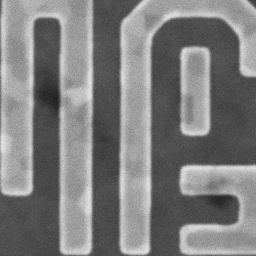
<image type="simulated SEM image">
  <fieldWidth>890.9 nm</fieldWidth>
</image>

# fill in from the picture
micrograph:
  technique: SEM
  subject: wiring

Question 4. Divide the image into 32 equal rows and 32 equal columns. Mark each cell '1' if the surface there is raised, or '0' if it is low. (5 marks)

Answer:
11111111111000000011111111111110
11111111111000000111111111111111
11110000111000001111100000001111
11110000111000011111000000000111
11110000111000011110000000000011
11110000111000011110000000000011
11110000111000011110000111000011
11110000111000011110000111000011
11110000111000011110000111000011
11110000111000011110000111000000
11110000111000011110000111000000
11110000111000011110000111000000
11110000111000011110000111000000
11110000111000011110000111000000
11110000111000011110000111000000
11110000111000011110000111000000
11110000111000011110000111000000
11110000111000011110000000000000
11110000111000011110000000000000
11110000111000011110000000000000
11110000111000011110000000000000
11110000111000011110000111111111
11110000111000011110000111111111
11110000111000011110000111111111
00000000111000011110000000000011
00000000111000011110000000000011
00000000111000011110000000000011
00000000111000011110000000000011
00000000111000011110000111111111
00000000111000011110000111111111
00000000111000011110000111111111
00000000111000000100000011001111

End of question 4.